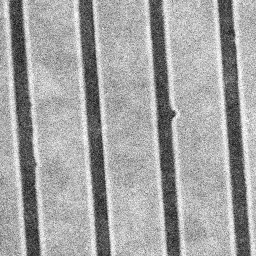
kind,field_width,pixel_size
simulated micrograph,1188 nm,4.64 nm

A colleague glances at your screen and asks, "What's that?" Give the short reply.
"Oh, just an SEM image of one or a few lines or trenches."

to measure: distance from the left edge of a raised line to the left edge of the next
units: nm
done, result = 323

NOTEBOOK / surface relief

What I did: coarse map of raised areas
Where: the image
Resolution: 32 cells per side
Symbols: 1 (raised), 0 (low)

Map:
10011111100011111100011111100111
10011111110011111100011111100111
10011111110011111110011111100111
10011111110011111110011111100011
10011111110011111110011111100011
10011111110011111110011111100011
10001111110011111110011111100011
10001111110011111110011111100011
10001111110011111110011111100011
10001111110011111110011111110011
10001111110001111110011111110011
11001111110001111110011111110011
11001111110001111110001111110011
11001111110001111110001111110011
11001111111001111110001111110011
11001111111001111110001111110011
11001111111001111110001111110011
11001111111001111110001111110001
11001111111001111111001111110001
11000111111001111111001111110001
11000111111001111111001111110001
11000111111001111111001111111001
11000111111001111111001111111001
11000111111001111111001111111001
11100111111000111111001111111001
11100111111000111111001111111001
11100111111100111111000111111001
11100111111100111111000111111001
11100111111100111111000111111001
11100111111100111111000111111001
11100111111100111111100111111001
11100111111100111111100111111000